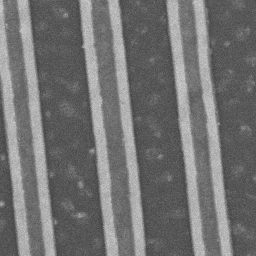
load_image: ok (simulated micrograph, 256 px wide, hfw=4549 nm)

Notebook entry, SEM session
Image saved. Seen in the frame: one or a few lines or trenches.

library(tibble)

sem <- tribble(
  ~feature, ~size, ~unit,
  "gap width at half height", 1080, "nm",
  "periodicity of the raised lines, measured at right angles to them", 1540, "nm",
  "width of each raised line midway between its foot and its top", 0.453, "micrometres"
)